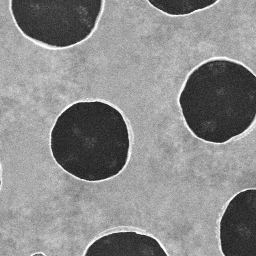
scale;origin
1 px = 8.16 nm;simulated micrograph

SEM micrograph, holes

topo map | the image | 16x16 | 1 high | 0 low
1000001111000111
1000001111111111
1100011111111111
1111111111111111
1111111111110000
1111111111100000
1111100111100000
1111000011110000
1110000011110001
1110000011111111
1111000011111111
1111111111111111
1111111111111110
1111111111111100
1111111111111100
1111110000111100